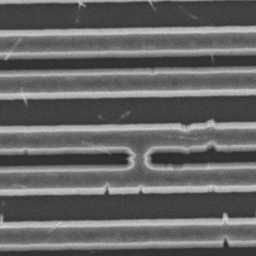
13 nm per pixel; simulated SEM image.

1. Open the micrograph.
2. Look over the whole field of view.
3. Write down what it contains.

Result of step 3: parallel lines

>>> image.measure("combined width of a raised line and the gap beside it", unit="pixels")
47.9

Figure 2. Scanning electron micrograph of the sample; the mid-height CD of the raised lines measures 320 nm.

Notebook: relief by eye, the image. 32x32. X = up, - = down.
--------------------------------
--------------------------------
--------------------------------
--------------------------------
XXXXXXXXXXXXXXXXXXXXXXXXXXXXXXXX
XXXXXXXXXXXXXXXXXXXXXXXXXXXXXXXX
XXXXXXXXXXXXXXXXXXXXXXXXXXXXXXXX
--------------------------------
--------------------------------
XXXXXXXXXXXXXXXXXXXXXXXXXXXXXXXX
XXXXXXXXXXXXXXXXXXXXXXXXXXXXXXXX
XXXXXXXXXXXXXXXXXXXXXXXXXXXXXXXX
--------------------------------
--------------------------------
--------------------------------
--------------------------X-----
XXXXXXXXXXXXXXXXXXXXXXXXXXXXXXXX
XXXXXXXXXXXXXXXXXXXXXXXXXXXXXXXX
XXXXXXXXXXXXXXXXXXXXXXXXXX-XXXXX
----------------XXX-------------
----------------XXX-------------
XXXXXXXXXXXXXXXXXXXXXXXXXXXXXXXX
XXXXXXXXXXXXXXXXXXXXXXXXXXXXXXXX
XXXXXXXXXXXXXXXXXXXXXXXXXXXXXXXX
--------------------------------
--------------------------------
--------------------------------
----------------------------X---
XXXXXXXXXXXXXXXXXXXXXXXXXXXXXXXX
XXXXXXXXXXXXXXXXXXXXXXXXXXXXXXXX
XXXXXXXXXXXXXXXXXXXXXXXXXXXX----
--------------------------------